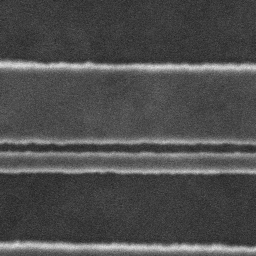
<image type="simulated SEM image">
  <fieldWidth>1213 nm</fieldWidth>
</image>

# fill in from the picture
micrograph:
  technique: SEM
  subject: lines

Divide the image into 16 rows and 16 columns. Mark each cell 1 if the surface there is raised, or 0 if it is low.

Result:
0000000000000000
0000000000000000
0000000000000000
0000000000000000
1111111111111111
1111111111111111
1111111111111111
1111111111111111
1111111111111111
1111111111111111
1111111111111111
0000000000000000
0000000000000000
0000000000000000
0000000000000000
1111111110000000